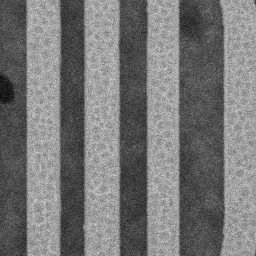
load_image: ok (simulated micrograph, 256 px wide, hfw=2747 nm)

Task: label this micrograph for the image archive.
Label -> one or a few lines or trenches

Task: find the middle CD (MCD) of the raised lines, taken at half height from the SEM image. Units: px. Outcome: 29.9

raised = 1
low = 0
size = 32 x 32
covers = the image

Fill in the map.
00001110000111100001110000001111
00001110000111100001110000001111
00001110000111100001110000001111
00001110000111100001110000001111
00001110000111100001110000001111
00001110000111100001110000001111
00001110000111100001110000001111
00001110000111100001110000001111
00001110000111100001110000001111
00001110000111100001110000001111
00001110000111100001110000001111
00001110000111100001110000001111
00001110000111100001110000001111
00001110000111100001110000001111
00001110000111100001110000001111
00001110000111100001110000001111
00001110000111100001110000001111
00001110000111100001110000001111
00001110000111100001110000001111
00001110000111100001110000001111
00001110000111100001110000001111
00001110000111100001110000001111
00001110000111100001110000001111
00001110000111100001110000001111
00001110000111100001110000001111
00001110000111100001110000001111
00001110000111100001110000001111
00001110000111100001110000001111
00001110000111100001110000001111
00001110000111100001110000001111
00001110000111100001110000001111
00001110000111100001110000001111